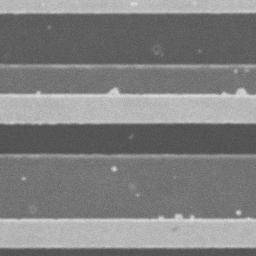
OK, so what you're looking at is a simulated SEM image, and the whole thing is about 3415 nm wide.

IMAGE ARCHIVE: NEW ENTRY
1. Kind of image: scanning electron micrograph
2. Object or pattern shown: lines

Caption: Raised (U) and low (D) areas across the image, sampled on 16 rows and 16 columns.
UUUUUUUUUUUUUUUU
DDDDDDDDDDDDDDDD
DDDDDDDDDDDDDDDD
DDDDDDDDDDDDDDDD
UUUUUUUUUUUUUUUU
UUUUUUUUUUUUUUUU
UUUUUUUUUUUUUUUU
UUUUUUUUUUUUUUUU
DDDDDDDDDDDDDDDD
DDDDDDDDDDDDDDDD
UUUUUUUUUUUUUUUU
UUUUUUUUUUUUUUUU
UUUUUUUUUUUUUUUU
UUUUUUUUUUUUUUUU
UUUUUUUUUUUUUUUU
DDDDDDDDDDDDDDDD